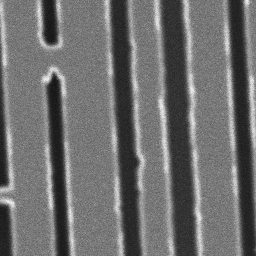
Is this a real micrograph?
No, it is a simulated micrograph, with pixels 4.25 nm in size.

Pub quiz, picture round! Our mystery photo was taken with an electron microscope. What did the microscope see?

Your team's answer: one or a few lines or trenches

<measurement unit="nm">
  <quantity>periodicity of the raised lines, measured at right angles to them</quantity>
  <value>262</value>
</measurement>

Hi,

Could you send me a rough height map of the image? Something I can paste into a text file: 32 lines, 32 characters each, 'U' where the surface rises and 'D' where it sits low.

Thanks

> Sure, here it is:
UUUUUDDUUUUUUUDDUUUUDDDUUUUUDDDU
UUUUUDDUUUUUUUDDUUUUDDDUUUUUUDDU
UUUUUDDUUUUUUUDDUUUUDDDUUUUUUDDU
UUUUUDDUUUUUUUDDUUUUDDDUUUUUUDDU
UUUUUDDUUUUUUUDDUUUUDDDUUUUUUDDU
UUUUUUDUUUUUUUDDUUUUDDDUUUUUUDDU
UUUUUUUUUUUUUUDDUUUUDDDUUUUUUDDU
UUUUUUUUUUUUUUDDUUUUDDDUUUUUUDDU
UUUUUUUUUUUUUUDDUUUUDDDUUUUUUDDU
UUUUUUDUUUUUUUDDUUUUDDDUUUUUUDDU
UUUUUUDDUUUUUUDDDUUUDDDDUUUUUDDU
UUUUUUDDUUUUUUDDDUUUUDDDUUUUUDDU
DUUUUUDDUUUUUUDDDUUUDDDDUUUUUDDU
DUUUUUDDUUUUUUDDDUUUUDDDUUUUUDDU
DUUUUUDDUUUUUUDDDUUUUDDDUUUUUDDU
DUUUUUDDUUUUUUDDDUUUUDDDUUUUUDDU
DUUUUUDDUUUUUUUDDUUUUDDDUUUUUDDU
DUUUUUDDUUUUUUUDDUUUUDDDUUUUUDDU
DUUUUUDDUUUUUUUDDUUUUDDDUUUUUDDD
DUUUUUDDUUUUUUUDDUUUUDDDUUUUUUDD
DUUUUUDDUUUUUUUDDUUUUDDDUUUUUUDD
DUUUUUDDUUUUUUUDDUUUUDDDUUUUUUDD
DUUUUUUDUUUUUUUDDUUUUDDDUUUUUUDD
UUUUUUUDUUUUUUUDDUUUUDDDUUUUUUDD
UUUUUUUDUUUUUUUDDUUUUDDDUUUUUUDD
DUUUUUUDUUUUUUUDDUUUUDDDUUUUUUDD
DUUUUUUDUUUUUUUDDUUUUDDDUUUUUUDD
DUUUUUUDUUUUUUUDDDUUUDDDDUUUUUDD
DUUUUUUDDUUUUUUDDDUUUDDDDUUUUUDD
DUUUUUUDDUUUUUUDDDUUUUDDDUUUUUDD
DDUUUUUDDUUUUUUDDDUUUUDDDUUUUUDD
DDUUUUUDDUUUUUUDDDUUUUDDDUUUUUDD